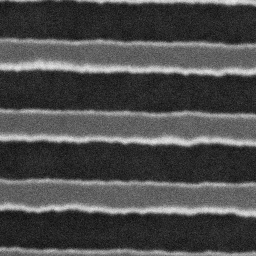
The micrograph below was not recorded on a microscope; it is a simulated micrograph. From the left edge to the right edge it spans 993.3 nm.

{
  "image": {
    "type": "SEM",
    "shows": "lines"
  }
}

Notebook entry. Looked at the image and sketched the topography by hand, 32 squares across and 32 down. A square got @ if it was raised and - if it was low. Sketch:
----------------------------@@-@
--------------------------------
--------------------------------
--------------------------------
--------------------------------
@@@@@@@@@@@@@@@@@@@@@@@@@@@@----
@@@@@@@@@@@@@@@@@@@@@@@@@@@@@@@@
@@@@@@@@@@@@@@@@@@@@@@@@@@@@@@@@
@@@@@@@@@@@@@@@@@@@@@@@@@@@@@@@@
--------------------------------
--------------------------------
--------------------------------
--------------------------------
--------------------------------
@@@@@@@@@@@@@@@@@@@@@@@@@@@@@@@@
@@@@@@@@@@@@@@@@@@@@@@@@@@@@@@@@
@@@@@@@@@@@@@@@@@@@@@@@@@@@@@@@@
@@@@@@@@@@@@@@@@@@@@@@@@@@@@@@@@
--------------------------------
--------------------------------
--------------------------------
--------------------------------
-----@--------------------------
@@@@@@@@@@@@@@@@@@@@@@@@@@@@@@@@
@@@@@@@@@@@@@@@@@@@@@@@@@@@@@@@@
@@@@@@@@@@@@@@@@@@@@@@@@@@@@@@@@
-------------@@@-@@@@@@@@@@@@@@@
--------------------------------
--------------------------------
--------------------------------
--------------------------------
@@@@@@@@@@@@@@@@@@@@@-----------